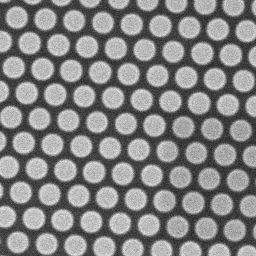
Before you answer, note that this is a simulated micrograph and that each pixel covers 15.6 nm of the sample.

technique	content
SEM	an array of small figures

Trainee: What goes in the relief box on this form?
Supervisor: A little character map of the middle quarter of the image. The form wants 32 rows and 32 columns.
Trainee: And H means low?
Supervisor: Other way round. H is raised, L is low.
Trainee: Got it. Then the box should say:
HHHHLLLHHHHLLLHHHHLLLLLLLLLLLLLL
HHHHLLLHHHHHLLHHHHLLLHHHHLLLLHHH
HHHHLLHHHHHHLLHHHHHLLHHHHHLLHHHH
HHHHLLLHHHHLLLHHHHHLLHHHHHLLHHHH
LLLLLLLLHHLLLLHHHHLLLHHHHLLLHHHH
LLLLLLLLLLLLLLLLLLLLLLLHLLLLLHHH
LLLHHHHLLLLHHHLLLLLLLLLLLLLLLLLL
LLLHHHHLLLHHHHHLLHHHHHLLLHHHLLLL
LLLHHHHHLLHHHHHLLHHHHHLLHHHHHLLL
LLLHHHHLLLHHHHHLLHHHHHLLHHHHHLLH
LLLLHHLLLLLHHHLLLHHHHHLLHHHHHLLH
LLLLLLLLLLLLLLLLLLLHLLLLLHHHLLLL
HHHLLLLHHHLLLLLHLLLLLLLLLLLLLLLL
HHHHLLHHHHHLLHHHHHLLLHHHLLLLLHHL
HHHLLLHHHHHLLHHHHHLLHHHHHLLLHHHH
HHHLLLHHHHHLLHHHHHLLHHHHHLLHHHHH
HHLLLLLHHHLLLHHHHLLLHHHHHLLHHHHH
LLLLLLLLLLLLLLLLLLLLLHHHLLLLHHHH
LLLHHHLLLLLLLLLLLLLLLLLLLLLLLLLL
LLHHHHHLLLHHHHLLLHHHHLLLLHHLLLLL
LLHHHHHLLHHHHHLLHHHHHLLLHHHHLLLH
LLHHHHHLLHHHHHLLHHHHHLLHHHHHLLLH
LLLHHHLLLHHHHHLLHHHHHLLHHHHHLLLH
LLLLLLLLLLLHLLLLLHHHLLLLHHHHLLLH
HHLLLLLLLLLLLLLLLLLLLLLLLLLLLLLL
HHHLLHHHHHLLLHHHLLLLLHHLLLLLLLLL
HHHLLHHHHHLLHHHHHLLLHHHHLLLHHHHL
HHHLLHHHHHLLHHHHHLLLHHHHLLLHHHHH
HHLLLHHHHHLLHHHHHLLHHHHHLLLHHHHH
LLLLLLLHLLLLLHHHLLLLHHHHLLLHHHHL
LLLHLLLLLLLLLLLLLLLLLLLLLLLLHHLL
LHHHHHLLLHHHHLLLLHHLLLLLLLLLLLLL